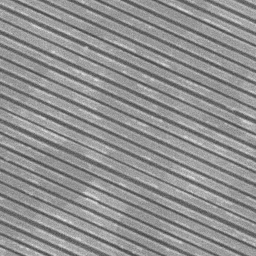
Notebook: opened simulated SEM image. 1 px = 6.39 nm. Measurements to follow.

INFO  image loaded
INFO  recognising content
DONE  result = parallel lines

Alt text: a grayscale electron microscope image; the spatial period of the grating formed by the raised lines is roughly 73.4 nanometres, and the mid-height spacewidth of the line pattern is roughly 24.8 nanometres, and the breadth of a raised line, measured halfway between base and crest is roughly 7.76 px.